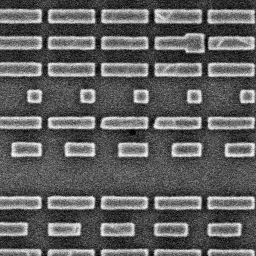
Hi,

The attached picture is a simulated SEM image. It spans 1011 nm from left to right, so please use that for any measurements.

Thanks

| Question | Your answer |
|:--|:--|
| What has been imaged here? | wiring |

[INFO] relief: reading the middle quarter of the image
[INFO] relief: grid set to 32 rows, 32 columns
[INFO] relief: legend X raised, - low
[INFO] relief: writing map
XXXXXXXX--XXXXXXXXXXX--XXXXXXXXX
XXXXXXXX--XXXXXXXXXXX--XXXXXXXXX
XXXXXXXX--XXXXXXXXXXX--XXXXXXXXX
--------------------------------
--------------------------------
--------------------------------
--------------------------------
----XXXX----------XXX----------X
----XXXX----------XXX----------X
-----XX-----------XXX----------X
--------------------------------
--------------------------------
--------------------------------
XXXXXXXX--XXXXXXXXXXX--XXXXXXXXX
XXXXXXXX--XXXXXXXXXXX--XXXXXXXXX
XXXXXXXX-XXXXXXXXXXXX--XXXXXXXXX
--------------------------------
--------------------------------
--------------------------------
--------------------------------
XXXXXXXX------XXXXXXX------XXXXX
XXXXXXXX------XXXXXXX------XXXXX
-XXXXXXX------XXXXXXX------XXXXX
--------------------------------
--------------------------------
--------------------------------
--------------------------------
--------------------------------
--------------------------------
--------------------------------
--------------------------------
--------------------------------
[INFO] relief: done